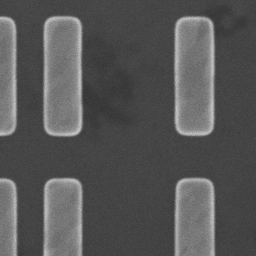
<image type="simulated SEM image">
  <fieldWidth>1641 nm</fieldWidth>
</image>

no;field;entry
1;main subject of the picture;wiring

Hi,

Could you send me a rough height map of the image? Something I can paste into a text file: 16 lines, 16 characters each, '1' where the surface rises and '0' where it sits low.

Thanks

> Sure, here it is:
0000000000000000
1001100000011000
1001100000011000
1001100000011000
1001100000011000
1001100000011000
1001100000011000
1001100000011000
0000000000000000
0000000000000000
0000000000000000
1001100000011000
1001100000011000
1001100000011000
1001100000011000
1001100000011000